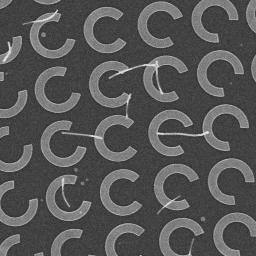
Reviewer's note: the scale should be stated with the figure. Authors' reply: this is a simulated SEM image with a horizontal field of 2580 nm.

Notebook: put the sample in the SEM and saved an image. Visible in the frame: an array of small figures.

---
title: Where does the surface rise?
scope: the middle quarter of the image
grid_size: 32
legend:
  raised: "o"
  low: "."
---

.........ooooooo....oooo...ooo..
.......ooooo.ooo....ooo.....ooo.
.......ooo..........oo..........
.......oo...........oo..........
......ooo...........oo..........
......oo............oo..........
.......oo............oo.........
..oo...ooo.....o.....ooooooo....
.ooo...oooo..oooo.....oooooo....
ooo.....oooooooo................
ooo.......oooo..................
o...............................
........................oooooo..
...........ooooo.......oooooooo.
oo.......oooooooo.....ooo....ooo
oo.......ooo...oo....ooo......o.
........ooo..........oo.........
........oo...........ooo........
........oo...........ooo........
........oo............oo........
........oo............oooo..o...
...oo...ooo....ooo.....ooooooo..
..ooo....ooooooooo.......oooo...
.ooo.......ooooo................
ooo.............................
o.........................ooooo.
.............ooo........oooooooo
...........ooooooo......ooo...oo
ooo.......oooo.ooo.....ooo.....o
ooo.......oo...........oo.......
.........ooo...........oo.......
.........oo............oo.......